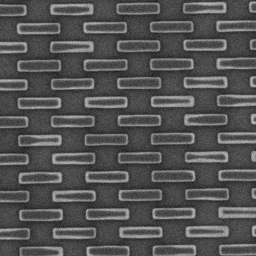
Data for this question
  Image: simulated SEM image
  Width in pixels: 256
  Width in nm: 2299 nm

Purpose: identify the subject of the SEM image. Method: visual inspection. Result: groups of lines, slits or small figures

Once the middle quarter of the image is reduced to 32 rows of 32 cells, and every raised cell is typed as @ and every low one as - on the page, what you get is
-----@@@@@@@@@@@------@@@@@@@@@@
-----@@@@@@@--------------------
--------------------------------
--------------------------------
@@@@@@@-------@@@@@@@@@@------@@
@@@@@@@-------@@@@@@@@@@------@@
--------------------------------
--------------------------------
---------@@@@@@-------@@@@@@@@@@
------@@@@@@@@@@------@@@@@@@@@@
------@@@@@@@@@-----------------
--------------------------------
--------------------------------
@@@@@@@-------@@@@@@@@@@-------@
@@@@@@@-------@@@@@@@@@@-------@
--@@@@@-------------------------
--------------------------------
--------------------------@@@@--
-----@@@@@@@@@@@------@@@@@@@@@@
-----@@@@@@@@@@@------@@@@@@@@@@
--------------------------------
--------------------------------
--@@@@@-------@@@@@@@@@@-------@
@@@@@@@@------@@@@@@@@@@-------@
@@@@@@@-------@@@-@@@@@@--------
--------------------------------
--------------------------------
------@@@@@@@@@@------@@@@@@@@@@
------@@@@@@@@@@------@@@@@@@@@@
--------------------------------
--------------------------------
-------------------------------@